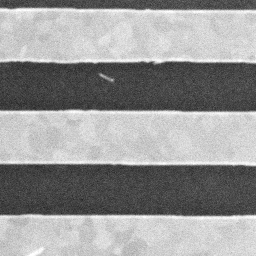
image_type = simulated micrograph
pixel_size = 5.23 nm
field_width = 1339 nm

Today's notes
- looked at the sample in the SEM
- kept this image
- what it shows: lines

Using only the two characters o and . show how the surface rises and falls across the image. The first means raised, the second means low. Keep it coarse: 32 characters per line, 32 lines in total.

................................
oooooooooooooooooooooooooooooooo
oooooooooooooooooooooooooooooooo
oooooooooooooooooooooooooooooooo
oooooooooooooooooooooooooooooooo
oooooooooooooooooooooooooooooooo
oooooooooooooooooooooooooooooooo
oooooooooooooooooooooooooooooooo
................................
................................
................................
................................
................................
................................
oooooooooooooooooooooooooooooooo
oooooooooooooooooooooooooooooooo
oooooooooooooooooooooooooooooooo
oooooooooooooooooooooooooooooooo
oooooooooooooooooooooooooooooooo
oooooooooooooooooooooooooooooooo
...............ooooooooooooooooo
................................
................................
................................
................................
................................
................................
oooooooooooooooooooooooooooooooo
oooooooooooooooooooooooooooooooo
oooooooooooooooooooooooooooooooo
oooooooooooooooooooooooooooooooo
oooooooooooooooooooooooooooooooo